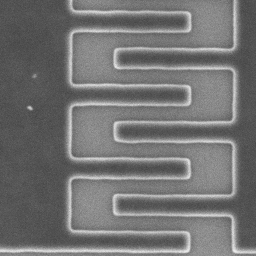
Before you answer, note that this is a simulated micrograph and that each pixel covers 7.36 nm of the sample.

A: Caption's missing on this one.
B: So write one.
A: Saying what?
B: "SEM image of groups of lines, slits or small figures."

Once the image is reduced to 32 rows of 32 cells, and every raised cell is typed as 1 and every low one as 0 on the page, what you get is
11111111100000000000000000000111
11111111111111111111101000000111
11111111111111111111111100000111
11111111111111111111111100000111
11111111100000000000000000000111
11111111100000000000000000000111
11111111100000111111111111111111
11111111100000111111111111111111
11111111100000011110111111111111
11111111100000000000000000000111
11111111100000000000000000000111
11111111111111111111111100000111
11111111111111111111111100000111
11111111100000000000000000000111
11111111100000000000000000000111
11111111100000111111111111111111
11111111100000111111111111111111
11111111100000011111111111111111
11111111100000000000000000000111
11111111100000000000000000000111
11111111111111111111111100000111
11111111111111111111111100000111
11111111100000000000000000000111
11111111100000000000000000000111
11111111100000011111111111111111
11111111100000111111111111111111
11111111100000111111111111111111
11111111100000000000000000000111
11111111100000000000000000000111
11111111111111111111111100000111
11111111111111111111111100000111
00000000000000000000000000000011